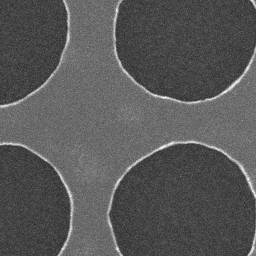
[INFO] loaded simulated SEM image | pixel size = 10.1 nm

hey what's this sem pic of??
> holes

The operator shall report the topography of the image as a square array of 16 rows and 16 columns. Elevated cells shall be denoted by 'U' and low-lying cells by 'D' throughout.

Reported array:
DDDDUUUDDDDDDDDD
DDDDUUUDDDDDDDDD
DDDDUUUDDDDDDDDD
DDDDUUUDDDDDDDDD
DDDUUUUUDDDDDDDU
DDUUUUUUUDDDDDUU
DUUUUUUUUUUUUUUU
UUUUUUUUUUUUUUUU
UUUUUUUUUUUUUUUU
DDUUUUUUUUDDDDUU
DDDUUUUUDDDDDDDU
DDDDUUUDDDDDDDDD
DDDDUUUDDDDDDDDD
DDDDUUUDDDDDDDDD
DDDDUUUDDDDDDDDD
DDDDUUUDDDDDDDDD